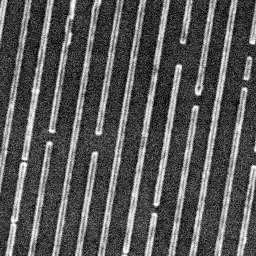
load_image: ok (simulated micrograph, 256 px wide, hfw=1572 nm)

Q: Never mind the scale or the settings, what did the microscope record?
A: parallel lines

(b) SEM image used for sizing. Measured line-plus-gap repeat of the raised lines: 140 nm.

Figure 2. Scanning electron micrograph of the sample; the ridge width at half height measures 0.0242 micrometres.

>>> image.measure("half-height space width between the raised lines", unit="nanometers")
115